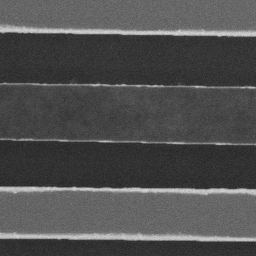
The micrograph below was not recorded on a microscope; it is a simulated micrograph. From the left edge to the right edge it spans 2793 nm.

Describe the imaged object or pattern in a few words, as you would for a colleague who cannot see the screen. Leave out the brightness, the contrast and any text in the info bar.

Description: lines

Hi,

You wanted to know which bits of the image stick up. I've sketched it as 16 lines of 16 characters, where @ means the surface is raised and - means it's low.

@@@@@@@@@@@@@@@@
@@@@@@@@@@@@@@@@
----------------
----------------
----------------
@@@@@@@@@@@@@@@@
@@@@@@@@@@@@@@@@
@@@@@@@@@@@@@@@@
@@@@@@@@@@@@@@@@
----------------
----------------
----------------
@@@@@@@@@@@@@@@@
@@@@@@@@@@@@@@@@
@@@@@@@@@@@@@@@@
----------------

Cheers